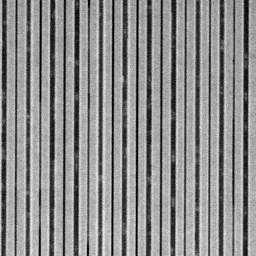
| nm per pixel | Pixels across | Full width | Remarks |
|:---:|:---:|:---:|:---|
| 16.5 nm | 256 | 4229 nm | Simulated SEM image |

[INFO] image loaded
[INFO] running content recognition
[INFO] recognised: parallel lines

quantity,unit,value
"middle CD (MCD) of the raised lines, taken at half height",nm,134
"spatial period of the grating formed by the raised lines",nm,198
